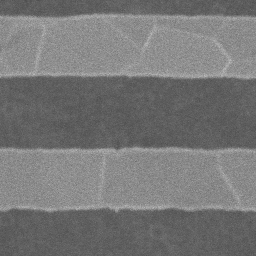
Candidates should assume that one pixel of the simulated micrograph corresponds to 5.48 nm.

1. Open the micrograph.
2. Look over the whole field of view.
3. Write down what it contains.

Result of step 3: one or a few lines or trenches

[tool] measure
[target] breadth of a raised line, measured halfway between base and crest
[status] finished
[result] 0.322 um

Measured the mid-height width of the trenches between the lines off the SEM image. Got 409 nanometres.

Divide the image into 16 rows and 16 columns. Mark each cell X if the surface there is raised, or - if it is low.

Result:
----------------
XXXXXXXXXXXXXXXX
XXXXXXXXXXXXXXXX
XXXXXXXXXXXXXXXX
XXXXXXXXXXXXXXXX
----------------
----------------
----------------
----------------
XXXXXXXXXXXXXXXX
XXXXXXXXXXXXXXXX
XXXXXXXXXXXXXXXX
XXXXXXXXXXXXXXXX
----------------
----------------
----------------